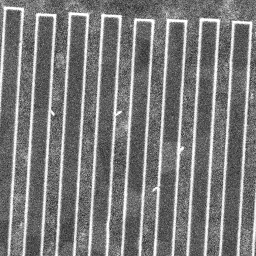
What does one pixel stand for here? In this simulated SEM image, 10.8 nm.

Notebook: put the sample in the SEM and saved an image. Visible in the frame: parallel lines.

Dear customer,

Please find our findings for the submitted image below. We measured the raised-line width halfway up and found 199 nm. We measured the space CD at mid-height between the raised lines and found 157 nm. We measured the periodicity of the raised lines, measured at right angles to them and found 32.7 pixels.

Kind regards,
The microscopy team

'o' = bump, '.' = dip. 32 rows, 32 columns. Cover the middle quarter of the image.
.oooo....oooo....ooooo...ooooo..
.oooo....oooo....ooooo...ooooo..
.oooo....oooo....oooo....ooooo..
.oooo....oooo....oooo....ooooo..
.oooo....oooo....oooo....ooooo..
.oooo....oooo....oooo....ooooo..
ooooo....oooo....oooo....ooooo..
ooooo....oooo....oooo....oooo...
ooooo....oooo....oooo....oooo...
ooooo....oooo....oooo....oooo...
ooooo....oooo....oooo....oooo...
ooooo...ooooo....oooo....oooo...
ooooo...ooooo...ooooo....oooo...
ooooo...ooooo...ooooo....oooo...
oooo....oooo....ooooo....oooo...
oooo....oooo....ooooo....oooo...
oooo....oooo....ooooo....oooo...
oooo....oooo....ooooo...ooooo...
oooo....oooo....ooooo...ooooo...
oooo....oooo....oooo....ooooo...
oooo....oooo....oooo....ooooo...
oooo....oooo....oooo....ooooo...
oooo....oooo....oooo....ooooo...
oooo....oooo....oooo....ooooo...
oooo....oooo....oooo....oooo....
oooo....oooo....oooo....oooo....
oooo....oooo....oooo....oooo....
oooo....oooo....oooo....oooo....
oooo....oooo....oooo....oooo....
oooo...ooooo....oooo....oooo....
oooo...ooooo...ooooo....oooo....
ooo....ooooo...ooooo...ooooo....